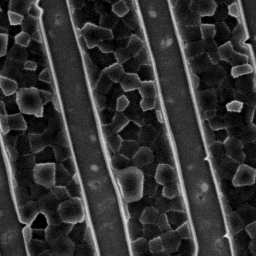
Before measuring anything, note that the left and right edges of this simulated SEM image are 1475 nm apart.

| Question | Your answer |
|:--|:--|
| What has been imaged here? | one or a few lines or trenches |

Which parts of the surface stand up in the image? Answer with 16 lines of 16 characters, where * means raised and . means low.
**..*****..****.
***..****..****.
***..****..****.
***..****..*****
***..*****..****
****..****..****
****..****..****
****..****..****
****..*****..***
*****..****..***
*****..****..***
.****..****..***
.****..*****..**
.*****..****..**
.*****..****..**
..****..****..**